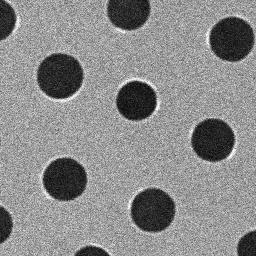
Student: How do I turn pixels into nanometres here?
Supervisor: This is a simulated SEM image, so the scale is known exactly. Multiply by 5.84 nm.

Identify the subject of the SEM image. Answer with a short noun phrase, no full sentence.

holes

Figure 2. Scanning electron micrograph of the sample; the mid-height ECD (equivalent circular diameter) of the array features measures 262 nanometres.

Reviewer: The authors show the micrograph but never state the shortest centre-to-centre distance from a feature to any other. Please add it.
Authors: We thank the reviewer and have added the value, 522 nanometres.